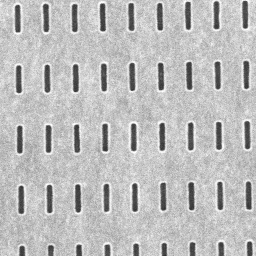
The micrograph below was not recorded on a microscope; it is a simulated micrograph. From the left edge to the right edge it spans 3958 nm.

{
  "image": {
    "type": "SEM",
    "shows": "a regular array of holes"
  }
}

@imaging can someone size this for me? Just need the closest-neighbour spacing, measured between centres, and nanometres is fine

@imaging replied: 436